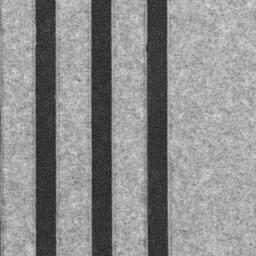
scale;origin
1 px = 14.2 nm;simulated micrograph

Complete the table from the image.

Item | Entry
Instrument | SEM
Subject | parallel lines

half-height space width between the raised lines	312	nm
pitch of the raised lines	792	nanometers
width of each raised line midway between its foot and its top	481	nm